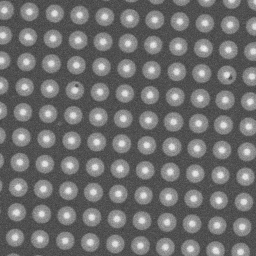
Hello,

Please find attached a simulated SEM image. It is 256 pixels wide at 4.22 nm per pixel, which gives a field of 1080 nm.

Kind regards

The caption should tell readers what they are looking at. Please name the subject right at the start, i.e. an array of small figures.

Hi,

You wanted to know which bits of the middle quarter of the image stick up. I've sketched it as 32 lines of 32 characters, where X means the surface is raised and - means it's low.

-XXXX--XXXXX-XXXXX--XXXX--XXXX--
-XXXX--XXXXX-XXXXX--XXXX--XXXX--
--------XXX---XXX---XXXX--XXXX--
---------------------XX---XXXX--
--XX----------------------------
-XXXX--XXXX---XX----------------
XXXXX--XXXX--XXXX---XXX---XXX---
-XXXX--XXXX--XXXX--XXXXX--XXXX--
-XXX---XXXX--XXXX--XXXXX--XXXX--
--------------XX----XXX---XXXX--
---------------------------X----
XXXX---XXX----X-----------------
XXXXX-XXXXX--XXXX--XXXX---XXX---
XXXX--XXXXX--XXXX--XXXX--XXXXX--
-XXX---XXXX--XXXX--XXXX--XXXXX-X
--------X----XXX---XXXX--XXXXX-X
--------------------------XXX---
XXX----XX-----------------------
XXXX--XXXX---XXX---XXX----XX----
XXXX--XXXX--XXXXX--XXXX--XXXX--X
XXXX--XXXX--XXXXX-XXXXX--XXXX--X
-------XX----XXX---XXXX--XXXX--X
--------------------X----XXXX--X
XXX-----------------------------
XXXX--XXXX--XXXX---XX-----------
XXXX--XXXX--XXXX--XXXX---XXX---X
XXX---XXXX--XXXX--XXXXX-XXXXX--X
-X----XXX---XXXX--XXXX--XXXXX--X
-------------------XXX---XXX---X
XX------------------------------
XXX---XXX---XXX-----------------
XXX--XXXXX--XXXX--XXXX---XXX----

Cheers